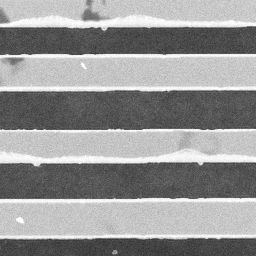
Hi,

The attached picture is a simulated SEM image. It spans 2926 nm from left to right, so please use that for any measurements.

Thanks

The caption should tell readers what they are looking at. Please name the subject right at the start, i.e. lines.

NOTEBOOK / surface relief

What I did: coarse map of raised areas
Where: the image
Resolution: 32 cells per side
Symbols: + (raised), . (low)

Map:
++++++++++++++++++++++++++++++++
++++++++++++++++++++++++++++++++
++++++++++++++++++++++++++++++++
................................
................................
................................
................................
++++++++++++++++++++++++++++++++
++++++++++++++++++++++++++++++++
++++++++++++++++++++++++++++++++
++++++++++++++++++++++++++++++++
................................
................................
................................
................................
................................
++++++++++++++++++++++++++++++++
++++++++++++++++++++++++++++++++
++++++++++++++++++++++++++++++++
++++++++++++++++++++++++++++++++
................................
................................
................................
................................
................................
++++++++++++++++++++++++++++++++
++++++++++++++++++++++++++++++++
++++++++++++++++++++++++++++++++
++++++++++++++++++++++++++++++++
++++++++++++++++++++++++++++++++
................................
................................